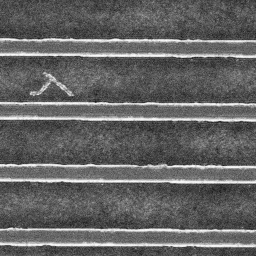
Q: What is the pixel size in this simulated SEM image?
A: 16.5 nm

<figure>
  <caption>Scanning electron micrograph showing lines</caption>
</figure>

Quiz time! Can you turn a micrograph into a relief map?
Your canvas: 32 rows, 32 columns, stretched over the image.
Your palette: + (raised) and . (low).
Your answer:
................................
................................
................................
................................
................................
++++++++++++++++++++++++++++++++
++++++++++++++++++++++++++++++++
................................
................................
................................
................................
................................
................................
++++++++++++++++++++++++++++++++
++++++++++++++++++++++++++++++++
................................
................................
................................
................................
................................
................................
++++++++++++++++++++++++++++++++
++++++++++++++++++++++++++++++++
................................
................................
................................
................................
................................
................................
++++++++++++++++++++++++++++++++
++++++++++++++++++++++++++++++++
................................